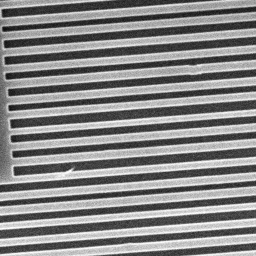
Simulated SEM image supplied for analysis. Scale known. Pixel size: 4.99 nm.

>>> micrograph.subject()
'parallel lines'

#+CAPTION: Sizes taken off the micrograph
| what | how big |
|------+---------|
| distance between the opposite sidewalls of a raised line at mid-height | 0.0386 microns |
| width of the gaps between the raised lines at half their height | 42.9 nm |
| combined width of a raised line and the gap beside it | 0.0785 microns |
